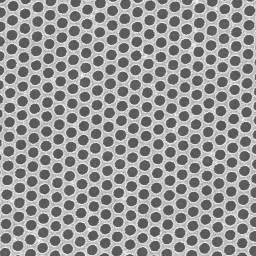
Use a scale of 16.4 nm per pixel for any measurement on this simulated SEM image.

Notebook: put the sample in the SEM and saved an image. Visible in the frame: a regular array of holes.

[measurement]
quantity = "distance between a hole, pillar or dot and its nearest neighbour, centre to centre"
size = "231 nm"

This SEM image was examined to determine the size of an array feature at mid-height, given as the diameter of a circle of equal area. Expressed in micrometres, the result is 0.182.